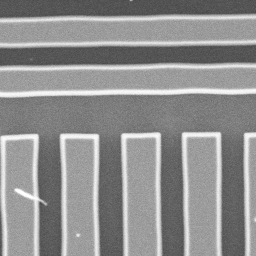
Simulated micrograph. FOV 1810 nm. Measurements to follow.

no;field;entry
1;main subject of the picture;groups of lines, slits or small figures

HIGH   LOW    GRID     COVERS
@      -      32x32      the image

--------------------------------
--------------------------------
@@@@@@@@@@@@@@@@@@@@@@@@@@@@@@@@
@@@@@@@@@@@@@@@@@@@@@@@@@@@@@@@@
@@@@@@@@@@@@@@@@@@@@@@@@@@@@@@@@
@@@@@@@@@@@@@@@@@@@@@@@@--------
--------------------------------
--------------------------------
@@@@@@@@@@@@@@@@@@@@@@@@@@@@@@@@
@@@@@@@@@@@@@@@@@@@@@@@@@@@@@@@@
@@@@@@@@@@@@@@@@@@@@@@@@@@@@@@@@
@@@@@@@@@@@@@@-----@@-----------
--------------------------------
--------------------------------
--------------------------------
--------------------------------
--------------------------------
@@@@@---@@@@---@@@@@---@@@@----@
@@@@@---@@@@----@@@@---@@@@----@
@@@@----@@@@----@@@@---@@@@----@
@@@@----@@@@----@@@@---@@@@----@
@@@@----@@@@----@@@@---@@@@----@
@@@@----@@@@----@@@@---@@@@----@
@@@@----@@@@----@@@@---@@@@----@
@@@@@---@@@@----@@@@---@@@@----@
@@@@@---@@@@----@@@@---@@@@----@
@@@@@---@@@@----@@@@---@@@@----@
-@@@@---@@@@----@@@@---@@@@----@
-@@@@---@@@@----@@@@---@@@@----@
-@@@@---@@@@----@@@@---@@@@----@
-@@@@---@@@@----@@@@---@@@@----@
-@@@@---@@@@----@@@@---@@@@----@